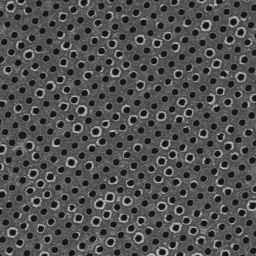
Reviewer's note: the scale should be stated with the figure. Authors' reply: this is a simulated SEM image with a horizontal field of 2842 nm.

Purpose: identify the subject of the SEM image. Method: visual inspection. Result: a regular array of holes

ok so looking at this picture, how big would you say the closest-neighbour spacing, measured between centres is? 0.136 um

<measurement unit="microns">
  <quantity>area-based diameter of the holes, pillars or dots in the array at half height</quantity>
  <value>0.0741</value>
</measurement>